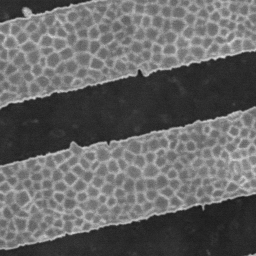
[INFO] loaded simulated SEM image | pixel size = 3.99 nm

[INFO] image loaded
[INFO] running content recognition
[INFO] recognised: one or a few lines or trenches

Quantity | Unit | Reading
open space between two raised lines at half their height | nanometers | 235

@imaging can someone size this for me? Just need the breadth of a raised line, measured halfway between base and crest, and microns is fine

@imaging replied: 0.313